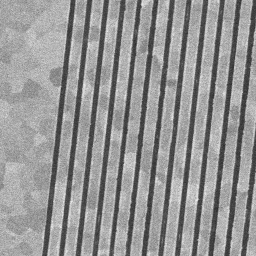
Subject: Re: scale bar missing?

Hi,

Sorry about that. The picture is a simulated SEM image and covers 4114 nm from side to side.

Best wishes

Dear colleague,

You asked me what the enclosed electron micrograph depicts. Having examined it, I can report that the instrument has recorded parallel lines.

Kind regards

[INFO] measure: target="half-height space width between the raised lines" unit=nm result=93.8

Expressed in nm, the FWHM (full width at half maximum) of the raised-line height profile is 172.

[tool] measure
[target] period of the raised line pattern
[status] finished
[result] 264 nm